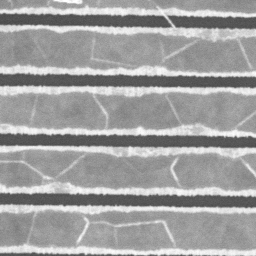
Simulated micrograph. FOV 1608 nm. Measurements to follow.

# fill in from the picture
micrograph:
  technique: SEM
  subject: lines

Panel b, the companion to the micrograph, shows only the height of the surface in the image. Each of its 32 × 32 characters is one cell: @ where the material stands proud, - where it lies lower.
@@@@@@@@@@@@@@@@@@@@@@@@@@@@@@@@
-------@-------@-@@@@-@@@@@@@@@@
--------------------------------
--@@@@@--@----------------------
@@@@@@@@@@@@@@@@@@@@@@@@@@@@@@@@
@@@@@@@@@@@@@@@@@@@@@@@@@@@@@@@@
@@@@@@@@@@@@@@@@@@@@@@@@@@@@@@@@
@@@@@@@@@@@@@@@@@@@@@@@@@@@@@@@@
@@@@@@@@@@@@@@@@@@@@@@@@@@@@@@@@
--------------------------------
--------------------------------
@@@@@@@@@@@@@@@@@@@@@@@@@@@@@@@@
@@@@@@@@@@@@@@@@@@@@@@@@@@@@@@@@
@@@@@@@@@@@@@@@@@@@@@@@@@@@@@@@@
@@@@@@@@@@@@@@@@@@@@@@@@@@@@@@@@
@@@@@@@@@@@@@@@@@@@@@@@@@@@@@@@@
------@@--@@@@@@--@@@@----@@@@@@
--------------------------------
---@@@@-------------------------
@@@@@@@@@@@@@@@@@@@@@@@@@@@@@@@@
@@@@@@@@@@@@@@@@@@@@@@@@@@@@@@@@
@@@@@@@@@@@@@@@@@@@@@@@@@@@@@@@@
@@@@@@@@@@@@@@@@@@@@@@@@@@@@@@@@
@@@@@@@-@@@@@@@@@@@@@@@@@@@@@@@@
--------------------------------
--------------------------------
@@@@@@@@@@@@@@@@@@@@@@@@@@@@@@@@
@@@@@@@@@@@@@@@@@@@@@@@@@@@@@@@@
@@@@@@@@@@@@@@@@@@@@@@@@@@@@@@@@
@@@@@@@@@@@@@@@@@@@@@@@@@@@@@@@@
@@@@@@@@@@@@@@@@@@@@@@@@@@@@@@@@
--------------@@@@@@-@@@@@@@@@@@